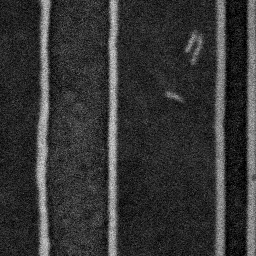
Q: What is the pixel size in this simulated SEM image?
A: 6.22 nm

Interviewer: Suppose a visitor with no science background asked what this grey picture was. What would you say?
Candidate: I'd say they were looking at one or a few lines or trenches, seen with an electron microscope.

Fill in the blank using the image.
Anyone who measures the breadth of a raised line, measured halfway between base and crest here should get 0.679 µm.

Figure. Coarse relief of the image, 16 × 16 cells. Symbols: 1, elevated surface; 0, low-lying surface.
1110000111111100
1110000111111100
1110000111111100
1110000111111100
1110000111111100
1110000111111100
1110000111111100
1110000111111100
1110000111111100
1110000111111100
1110000111111100
1110000111111100
1110000111111100
1110000111111100
1110000111111100
1110000111111100